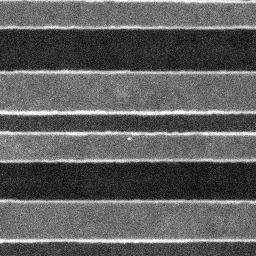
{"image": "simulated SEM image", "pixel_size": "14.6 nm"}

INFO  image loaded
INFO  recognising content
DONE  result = lines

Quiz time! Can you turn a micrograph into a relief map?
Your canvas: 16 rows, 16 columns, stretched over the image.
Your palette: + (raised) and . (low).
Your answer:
++++++++++++++++
++++++++++++++++
................
................
................
++++++++++++++++
++++++++++++++++
++++++++++++++++
++++++++++++++++
++++++++++++++++
................
................
................
++++++++++++++++
++++++++++++++++
++++++++++++++++